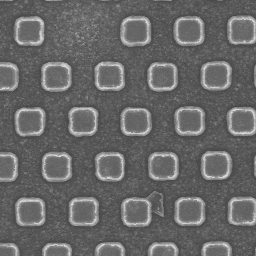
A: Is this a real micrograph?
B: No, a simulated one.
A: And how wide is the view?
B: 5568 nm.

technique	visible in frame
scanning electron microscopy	a regular array of raised bodies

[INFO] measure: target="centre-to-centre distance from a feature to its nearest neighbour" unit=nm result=1130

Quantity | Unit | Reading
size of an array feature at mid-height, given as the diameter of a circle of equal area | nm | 641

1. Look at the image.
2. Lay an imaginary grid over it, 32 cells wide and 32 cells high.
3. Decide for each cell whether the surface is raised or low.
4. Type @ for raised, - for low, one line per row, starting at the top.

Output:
--------------------------------
--------------------------------
--@@@-----------@@----@@@----@@@
--@@@----------@@@@---@@@----@@@
--@@@----------@@@@---@@@----@@@
----------------@---------------
--------------------------------
--------------------------------
@@---@@@@---@@@----@@@---@@@@---
@@---@@@@---@@@----@@@---@@@@---
@@---@@@@---@@@----@@@---@@@@---
--------------------------------
--------------------------------
---------@@------------@--------
--@@@----@@@---@@@@---@@@----@@@
--@@@----@@@---@@@@---@@@----@@@
--@@@----@@@----@@----@@@----@@@
--------------------------------
--------------------------------
@@----@@@---@@@----@@@----@@@---
@@---@@@@---@@@----@@@---@@@@---
@@---@@@@---@@@----@@@---@@@@---
-------------@------------------
--------------------------------
--------------------------------
--@@@----@@@---@@@@---@@@----@@@
--@@@----@@@---@@@@---@@@----@@@
--@@@----@@@---@@@@---@@@----@@@
--------------------------------
--------------------------------
--------------------------@@----
@@---@@@@---@@@----@@@---@@@@---